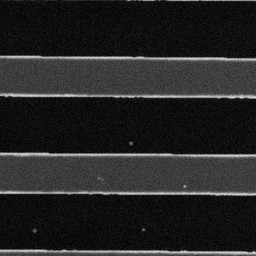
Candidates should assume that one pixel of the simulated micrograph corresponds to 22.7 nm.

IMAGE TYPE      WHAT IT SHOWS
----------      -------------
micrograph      lines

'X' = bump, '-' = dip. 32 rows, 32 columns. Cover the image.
--------------------------------
--------------------------------
--------------------------------
--------------------------------
--------------------------------
--------------------------------
--------------------------------
XXXXXXXXXXXXXXXXXXXXXXXXXXXXXXXX
XXXXXXXXXXXXXXXXXXXXXXXXXXXXXXXX
XXXXXXXXXXXXXXXXXXXXXXXXXXXXXXXX
XXXXXXXXXXXXXXXXXXXXXXXXXXXXXXXX
XXXXXXXXXXXXXXXXXXXXXXXXXXXXXXXX
--------------------------------
--------------------------------
--------------------------------
--------------------------------
--------------------------------
--------------------------------
--------------------------------
XXXXXXXXXXXXXXXXXXXXXXXXXXXXXXXX
XXXXXXXXXXXXXXXXXXXXXXXXXXXXXXXX
XXXXXXXXXXXXXXXXXXXXXXXXXXXXXXXX
XXXXXXXXXXXXXXXXXXXXXXXXXXXXXXXX
XXXXXXXXXXXXXXXXXXXXXXXXXXXXXXXX
--------------------------------
--------------------------------
--------------------------------
--------------------------------
--------------------------------
--------------------------------
--------------------------------
XXXXXXXXXXXXXXXXXXXXX-----------